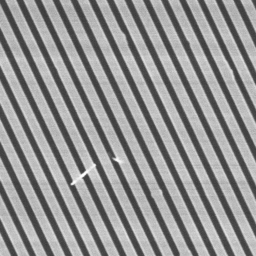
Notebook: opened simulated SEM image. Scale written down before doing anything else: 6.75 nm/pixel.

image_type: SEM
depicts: parallel lines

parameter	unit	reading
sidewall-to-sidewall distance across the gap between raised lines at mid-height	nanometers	49.6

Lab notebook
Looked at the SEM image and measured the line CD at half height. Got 0.0618 µm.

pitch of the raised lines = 110 nm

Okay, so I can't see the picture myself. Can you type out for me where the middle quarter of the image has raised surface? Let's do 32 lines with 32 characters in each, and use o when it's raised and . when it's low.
..ooo..oo..ooo..oo..ooo..oo..ooo
o..oo..ooo..oo..ooo..oo..ooo..oo
o..ooo..oo..ooo..oo..ooo..oo..oo
oo..oo..ooo..oo..ooo..oo..ooo..o
oo..ooo..oo..ooo..oo..ooo..oo..o
ooo..oo..ooo..oo..ooo..oo..ooo..
.oo..ooo..oo..ooo..oo..ooo..oo..
.oo...oo..ooo..oo..oo...oo..ooo.
..oo..ooo..oo..ooo..oo..ooo..oo.
..oo...oo..ooo..oo..oo...oo..ooo
o.ooo..oo...oo..ooo..oo..oo...oo
o..ooo.ooo..ooo..oo..oo...oo..oo
oo.ooo..oo...oo..ooo..oo..oo...o
oo..ooo.ooo..oo...oo..oo..ooo..o
oo..ooo..oo..ooo..oo...oo..oo...
.oo..oo..ooo..oo...oo..oo..ooo..
.oo..ooo..oo..ooo..oo...oo..oo..
.ooo..oo..ooo..oo..ooo..oo..ooo.
..oo..ooo..oo..ooo..oo...oo..oo.
..ooo..oo..ooo..oo..ooo..oo..ooo
o..oo..ooo..oo..ooo..oo..ooo..oo
o..ooo..oo..ooo..oo..ooo..oo..oo
oo..oo..ooo..oo..ooo..oo..ooo..o
oo..ooo..oo..ooo..oo..ooo..oo..o
ooo..oo..ooo..oo..ooo..oo..ooo..
.oo..ooo..oo..ooo..oo..ooo..oo..
.ooo..oo..oo...oo..ooo..oo..ooo.
..oo..ooo..oo..ooo..oo..ooo..oo.
..ooo..oo..ooo..oo..ooo..oo..oo.
..ooo..ooo.ooo..oo...oo..ooo..oo
o..oo...oo..oo...oo..ooo..oo..oo
o...oo..ooo.ooo..oo...oo..ooo..o